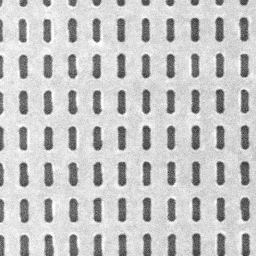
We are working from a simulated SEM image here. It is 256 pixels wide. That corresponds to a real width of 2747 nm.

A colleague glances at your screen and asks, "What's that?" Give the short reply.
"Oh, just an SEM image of a regular array of holes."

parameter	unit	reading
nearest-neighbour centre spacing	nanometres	262